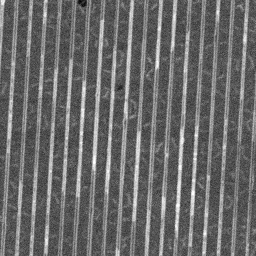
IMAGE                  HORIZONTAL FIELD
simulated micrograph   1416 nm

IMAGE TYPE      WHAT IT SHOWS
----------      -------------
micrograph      parallel lines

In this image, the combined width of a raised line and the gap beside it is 79.4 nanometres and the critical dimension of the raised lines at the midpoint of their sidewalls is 0.0159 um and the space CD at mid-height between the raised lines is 63.5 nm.